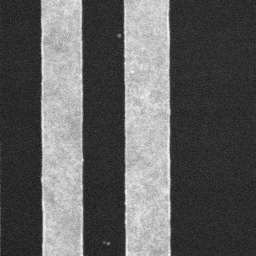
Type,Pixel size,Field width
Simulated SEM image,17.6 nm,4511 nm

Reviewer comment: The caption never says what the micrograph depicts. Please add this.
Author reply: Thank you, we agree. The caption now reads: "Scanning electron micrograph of wiring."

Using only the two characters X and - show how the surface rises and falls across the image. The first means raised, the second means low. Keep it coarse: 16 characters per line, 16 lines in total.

---XX---XXX-----
---XX---XXX-----
---XX---XXX-----
---XX---XXX-----
---XX---XXX-----
---XX---XXX-----
---XX---XXX-----
---XX---XXX-----
---XX---XXX-----
---XX---XXX-----
---XX---XXX-----
---XX---XXX-----
---XX---XXX-----
---XX---XXX-----
---XX---XXX-----
---XX---XXX-----